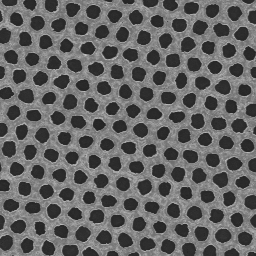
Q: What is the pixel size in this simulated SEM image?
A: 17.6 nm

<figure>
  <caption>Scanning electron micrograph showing a regular array of holes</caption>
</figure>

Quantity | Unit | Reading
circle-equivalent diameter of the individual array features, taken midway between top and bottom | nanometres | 244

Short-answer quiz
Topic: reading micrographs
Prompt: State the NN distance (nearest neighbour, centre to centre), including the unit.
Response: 365 nanometers